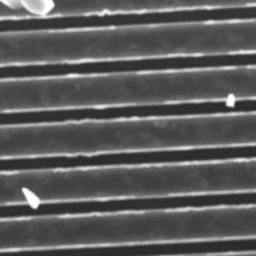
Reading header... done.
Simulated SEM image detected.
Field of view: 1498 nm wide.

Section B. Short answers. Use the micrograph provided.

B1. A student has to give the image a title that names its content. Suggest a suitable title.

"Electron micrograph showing parallel lines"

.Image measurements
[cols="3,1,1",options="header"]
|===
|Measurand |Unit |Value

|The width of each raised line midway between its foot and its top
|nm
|197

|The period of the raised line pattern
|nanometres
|270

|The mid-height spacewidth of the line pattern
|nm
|73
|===